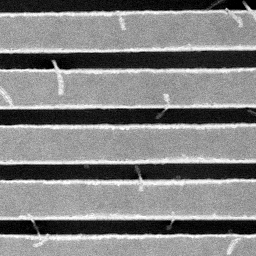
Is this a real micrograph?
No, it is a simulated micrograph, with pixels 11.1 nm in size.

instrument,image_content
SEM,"lines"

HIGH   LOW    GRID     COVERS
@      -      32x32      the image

--------------------------------
--------------@@@@@@@@@@@@@@@@@@
@@@@@@@@@@@@@@@@@@@@@@@@@@@@@@@@
@@@@@@@@@@@@@@@@@@@@@@@@@@@@@@@@
@@@@@@@@@@@@@@@@@@@@@@@@@@@@@@@@
@@@@@@@@@@@@@@@@@@@@@@@@@@@@@@@@
@@@@@@@-@-----------------------
--------------------------------
--------------------------------
@@@@@@@@@@@@@@@@@@@@@@@@@@@@@@@@
@@@@@@@@@@@@@@@@@@@@@@@@@@@@@@@@
@@@@@@@@@@@@@@@@@@@@@@@@@@@@@@@@
@@@@@@@@@@@@@@@@@@@@@@@@@@@@@@@@
@@@@@@@@@@@-@@------@-----------
--------------------------------
--------------------------------
@@@@@@@@@@@@@@@@@@@@@@@@@@@@@@@@
@@@@@@@@@@@@@@@@@@@@@@@@@@@@@@@@
@@@@@@@@@@@@@@@@@@@@@@@@@@@@@@@@
@@@@@@@@@@@@@@@@@@@@@@@@@@@@@@@@
@@------------------------------
--------------------------------
--@@@@--@@@@@-@-@@-@@@@@@@@@@@@@
@@@@@@@@@@@@@@@@@@@@@@@@@@@@@@@@
@@@@@@@@@@@@@@@@@@@@@@@@@@@@@@@@
@@@@@@@@@@@@@@@@@@@@@@@@@@@@@@@@
@@@@@@@@@@@@@@@@@@@@@@@@@@@@@@@@
----@----------------@----------
--------------------------------
@@@@@@@@@@@@@@@@@@@@@@@@@@@@@@@@
@@@@@@@@@@@@@@@@@@@@@@@@@@@@@@@@
@@@@@@@@@@@@@@@@@@@@@@@@@@@@@@@@